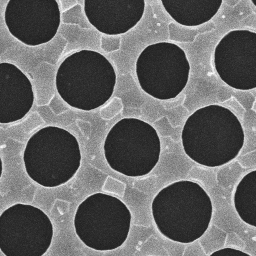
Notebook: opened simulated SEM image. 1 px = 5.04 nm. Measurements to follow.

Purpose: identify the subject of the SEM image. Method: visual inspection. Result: holes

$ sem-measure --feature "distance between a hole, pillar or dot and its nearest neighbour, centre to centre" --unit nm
404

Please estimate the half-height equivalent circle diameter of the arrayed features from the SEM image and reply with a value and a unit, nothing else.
0.294 um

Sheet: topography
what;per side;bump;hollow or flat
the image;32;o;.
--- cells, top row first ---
o......oooo.......oo........oooo
o......oooo.......ooo......ooooo
o......oooo......ooooo....oooooo
o......ooooo....oooooooooooooooo
oo.....ooooooooooooooooooooo....
ooo..oooooooooooooo...ooooo.....
oooooooooo..oooooo.....oooo.....
oooooooo.....oooo......oooo.....
..ooooo.......ooo.......ooo.....
...oooo.......ooo.......ooo.....
....ooo.......ooo......ooooo....
....ooo.......oooo.....ooooooooo
....oooo.....ooooooooooooooooooo
....ooooo...ooooooooooooo...oooo
...ooooooooooooooooooooo.....ooo
oooooooooooooo.....oooo.......oo
ooooo....ooooo......ooo.......oo
oooo......ooo.......ooo........o
ooo.......ooo.......ooo.......oo
ooo.......ooo.......oooo......oo
ooo.......oooo......ooooo...oooo
ooo......oooooo....oooooooooooo.
oooo.....ooooooooooooooooooooo..
ooooooooooooooooooooo....ooooo..
ooooooooooo...oooooo......ooo...
oooooooooo......ooo.......ooo...
.....ooooo......ooo........ooo..
......ooo.......ooo.......oooo..
.......oo.......oooo......oooooo
.......ooo......ooooo....ooooooo
......ooooo....ooooooooooooooooo
......ooooooooooooooooooooo...oo